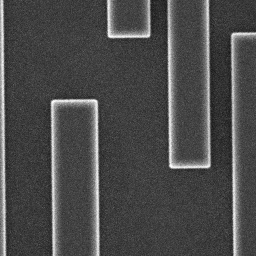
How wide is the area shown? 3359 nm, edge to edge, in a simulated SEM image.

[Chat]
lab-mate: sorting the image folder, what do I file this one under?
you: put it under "groups of lines, slits or small figures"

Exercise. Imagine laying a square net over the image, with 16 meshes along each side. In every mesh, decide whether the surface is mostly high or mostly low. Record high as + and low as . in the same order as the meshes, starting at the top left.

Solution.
.......++..++...
.......++..++...
...........++..+
...........++..+
...........++..+
...........++..+
...+++.....++..+
...+++.....++..+
...+++.....++..+
...+++.....++..+
...+++.........+
...+++.........+
...+++.........+
...+++.........+
...+++.........+
...+++.........+